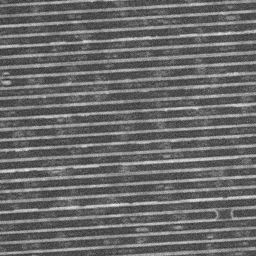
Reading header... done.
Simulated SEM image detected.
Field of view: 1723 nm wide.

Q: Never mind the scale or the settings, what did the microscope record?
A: parallel lines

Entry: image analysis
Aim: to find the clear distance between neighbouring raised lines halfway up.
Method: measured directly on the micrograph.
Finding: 55.4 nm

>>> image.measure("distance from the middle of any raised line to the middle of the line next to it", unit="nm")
69.4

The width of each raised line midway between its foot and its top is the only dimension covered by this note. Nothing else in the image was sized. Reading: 2.5 pixels